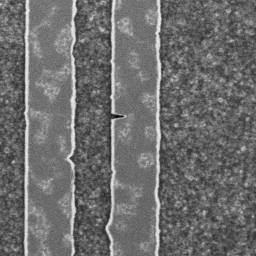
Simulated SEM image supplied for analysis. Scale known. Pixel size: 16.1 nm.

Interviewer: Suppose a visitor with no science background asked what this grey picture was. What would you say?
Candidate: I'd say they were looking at one or a few lines or trenches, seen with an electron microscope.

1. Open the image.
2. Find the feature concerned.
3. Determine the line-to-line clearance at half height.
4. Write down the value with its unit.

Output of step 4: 627 nanometers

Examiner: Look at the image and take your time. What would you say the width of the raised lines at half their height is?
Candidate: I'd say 754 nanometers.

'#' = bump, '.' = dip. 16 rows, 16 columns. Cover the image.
..###..###......
..###..###......
..###..###......
..###..###......
..###..###......
..###..###......
..###..###......
..###..###......
..###..###......
..##...###......
..###..###......
..###..###......
..###..###......
..###..###......
..###..###......
..###..###......